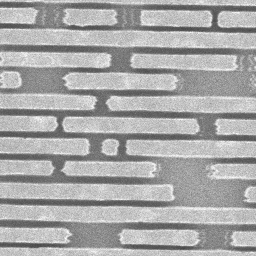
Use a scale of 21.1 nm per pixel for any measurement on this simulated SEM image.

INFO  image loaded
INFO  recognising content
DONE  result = parallel lines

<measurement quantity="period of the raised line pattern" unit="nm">464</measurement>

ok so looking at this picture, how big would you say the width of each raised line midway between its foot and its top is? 328 nm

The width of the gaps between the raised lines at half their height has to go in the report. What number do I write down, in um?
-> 0.127